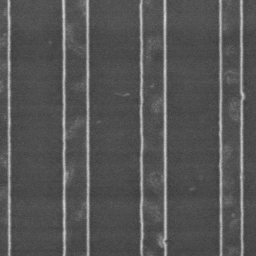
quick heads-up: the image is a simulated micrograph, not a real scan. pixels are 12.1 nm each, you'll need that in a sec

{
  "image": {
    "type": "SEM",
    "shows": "one or a few lines or trenches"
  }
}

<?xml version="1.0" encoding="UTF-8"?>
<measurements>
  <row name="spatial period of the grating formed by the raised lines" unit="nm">936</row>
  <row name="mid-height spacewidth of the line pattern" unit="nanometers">661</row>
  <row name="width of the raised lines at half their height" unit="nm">285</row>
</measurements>